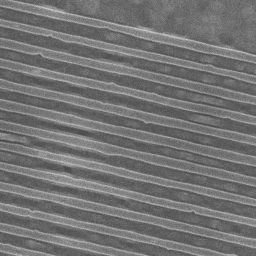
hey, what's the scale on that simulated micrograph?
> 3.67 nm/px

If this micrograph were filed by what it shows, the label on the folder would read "parallel lines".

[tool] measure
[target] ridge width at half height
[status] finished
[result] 0.0287 um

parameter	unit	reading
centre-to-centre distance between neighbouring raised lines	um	0.0734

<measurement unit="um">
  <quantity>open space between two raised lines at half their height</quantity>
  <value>0.0443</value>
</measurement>